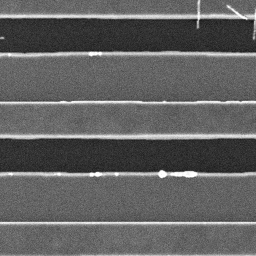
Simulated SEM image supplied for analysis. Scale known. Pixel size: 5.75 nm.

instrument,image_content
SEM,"lines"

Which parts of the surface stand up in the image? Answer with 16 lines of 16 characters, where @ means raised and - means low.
@@@@@@@@@@@@@@@@
----------------
----------------
@@@@@@@@@@@@@@@@
@@@@@@@@@@@@@@@@
@@@@@@@@@@@@@@@@
@@@@@@@@@@@@@@@@
@@@@@@@@@@@@@@@@
@@@@@@@@@@@@@@@@
----------------
----------------
@@@@@@@@@@@@@@@@
@@@@@@@@@@@@@@@@
@@@@@@@@@@@@@@@@
@@@@@@@@@@@@@@@@
@@@@@@@@@@@@@@@@